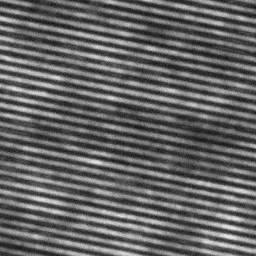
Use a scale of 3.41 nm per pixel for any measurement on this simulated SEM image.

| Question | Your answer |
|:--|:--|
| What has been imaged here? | parallel lines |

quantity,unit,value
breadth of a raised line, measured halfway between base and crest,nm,12.1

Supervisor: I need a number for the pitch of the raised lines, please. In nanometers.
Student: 32.1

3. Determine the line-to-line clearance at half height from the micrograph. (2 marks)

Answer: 20.9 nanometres